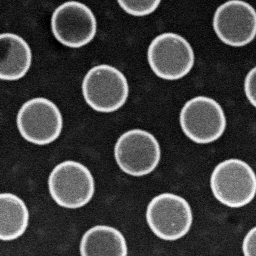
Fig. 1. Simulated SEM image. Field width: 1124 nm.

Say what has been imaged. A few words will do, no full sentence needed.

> a regular array of raised bodies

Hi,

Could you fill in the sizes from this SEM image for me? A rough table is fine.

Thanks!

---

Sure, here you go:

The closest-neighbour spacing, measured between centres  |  313 nanometres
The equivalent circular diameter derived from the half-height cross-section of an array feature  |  0.188 µm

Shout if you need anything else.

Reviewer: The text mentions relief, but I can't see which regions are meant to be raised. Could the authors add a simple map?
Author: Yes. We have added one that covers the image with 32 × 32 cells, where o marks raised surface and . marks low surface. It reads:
........oo.....oooo.........ooo.
.......oooo.....oo.........ooooo
.......ooooo...............ooooo
.......ooooo...............ooooo
oo.....oooo.........oo.....ooooo
ooo.....oo.........oooo......o..
oooo...............ooooo........
oooo...............ooooo........
ooo.........oo.....ooooo........
oo.........oooo.....oo.........o
...........ooooo...............o
...........ooooo...............o
...........oooo.........oo.....o
...oooo.....oo.........oooo.....
..ooooo................ooooo....
..ooooo................ooooo....
...oooo..........o.....ooooo....
....oo.........oooo......o......
...............ooooo............
...............ooooo............
........oo.....oooo.........oo..
.......oooo.....oo.........oooo.
......ooooo................ooooo
......ooooo................ooooo
o......oooo.........o......oooo.
ooo.....oo.........oooo......o..
ooo................ooooo........
ooo................ooooo........
ooo.........o......oooo.........
oo.........oooo.....oo.........o
..........ooooo................o
..........oooooo...............o